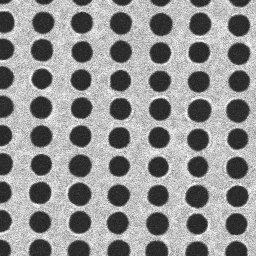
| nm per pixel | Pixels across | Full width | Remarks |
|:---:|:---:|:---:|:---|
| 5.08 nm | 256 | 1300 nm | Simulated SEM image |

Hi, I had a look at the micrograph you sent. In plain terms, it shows a regular array of holes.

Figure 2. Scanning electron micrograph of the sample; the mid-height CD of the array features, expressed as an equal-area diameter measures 0.109 µm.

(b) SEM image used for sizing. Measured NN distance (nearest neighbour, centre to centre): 0.144 um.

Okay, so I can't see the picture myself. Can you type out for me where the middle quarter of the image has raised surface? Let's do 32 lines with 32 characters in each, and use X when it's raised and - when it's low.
XXXXXXXXXXXXXXXXXXXXXXXXXXXXXXXX
XXXX-XXXXXXXXX-XXXXXXXXXXXXXXXXX
XX----XXXXXX----XXXXXX----XXXXXX
XX-----XXXXX-----XXXX-----XXXXX-
XX-----XXXX------XXXX------XXXX-
XX----XXXXXX----XXXXXX----XXXXX-
XXXX-XXXXXXX---XXXXXXX---XXXXXXX
XXXXXXXXXXXXXXXXXXXXXXXXXXXXXXXX
XXX--XXXXXXXXX-XXXXXXXXXXXXXXXXX
XX-----XXXXX----XXXXXX----XXXXXX
XX-----XXXX------XXXX------XXXX-
XX-----XXXX------XXXX------XXXX-
XX----XXXXXX-----XXXX------XXXX-
XXXX-XXXXXXX----XXXXXX----XXXXX-
XXXXXXXXXXXXXXXXXXXXXXXXXXXXXXXX
XXX--XXXXXXXXXXXXXXXXXXXXXXXXXXX
XX----XXXXXX----XXXXXX----XXXXXX
XX-----XXXX-----XXXXX-----XXXXX-
X------XXXX-----XXXXX-----XXXXX-
XX----XXXXX-----XXXXX-----XXXXX-
XXX---XXXXXX----XXXXXX---XXXXXX-
XXXXXXXXXXXXXXXXXXXXXXXXXXXXXXXX
XXXXXXXXXXXXXXXXXXXXXXXXXXXXXXXX
XX----XXXXXX---XXXXXXXX--XXXXXXX
X------XXXXX----XXXXX-----XXXXX-
X------XXXX-----XXXXX-----XXXXX-
X------XXXX-----XXXXX-----XXXXX-
XX----XXXXXX---XXXXXXX---XXXXXXX
XXXXXXXXXXXXXXXXXXXXXXXXXXXXXXXX
XXXXXXXXXXXXXXXXXXXXXXXXXXXXXXXX
XX----XXXXXX---XXXXXXXX-XXXXXXXX
X------XXXX-----XXXXX-----XXXXX-